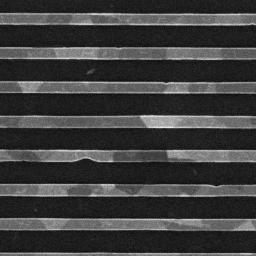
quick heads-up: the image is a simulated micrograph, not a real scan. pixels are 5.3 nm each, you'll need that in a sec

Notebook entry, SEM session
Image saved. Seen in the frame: parallel lines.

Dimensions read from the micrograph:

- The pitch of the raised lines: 182 nanometres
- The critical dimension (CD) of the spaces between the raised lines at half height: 122 nanometres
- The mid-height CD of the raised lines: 56.4 nanometers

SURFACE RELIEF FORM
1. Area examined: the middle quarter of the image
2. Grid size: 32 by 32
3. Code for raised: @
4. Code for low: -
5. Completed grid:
--------------------------------
--------------------------------
--------------------------------
--------------------------------
--------------------------------
@@@@@@@@@@@@@@@@@@@@@@@@@@@@@@@@
@@@@@@@@@@@@@@@@@@@@@@@@@@@@@@@@
--------------------------------
--------------------------------
--------------------------------
--------------------------------
--------------------------------
--------------------------------
@@@@@@@@@@@@@@@@@@@@@@@@@@@@@@@@
@@@@@@@@@@@@@@@@@@@@@@@@@@@@@@@@
@@@@@@@@@@@@@@@@@@@@@@@@@@@@@@@@
--------------------------------
--------------------------------
--------------------------------
--------------------------------
--------------------------------
--------------------------------
@@@@@@@@@@@@@@@@@@@@@@@@@@@@@@@@
@@@@@@@@@@@@@@@@@@@@@@@@@@@@@@@@
--------------------------------
--------------------------------
--------------------------------
--------------------------------
--------------------------------
--------------------------------
@@@@@@@@@@@@@@@@@@@@@@@@@@@@@@@@
@@@@@@@@@@@@@@@@@@@@@@@@@@@@@@@@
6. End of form